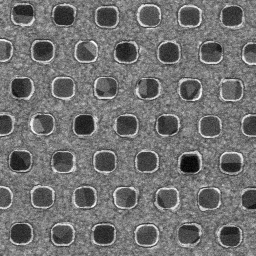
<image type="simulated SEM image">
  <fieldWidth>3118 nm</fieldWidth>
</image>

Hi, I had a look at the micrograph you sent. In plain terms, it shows a regular array of raised bodies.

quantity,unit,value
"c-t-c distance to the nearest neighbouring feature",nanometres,501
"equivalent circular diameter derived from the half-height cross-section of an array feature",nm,292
